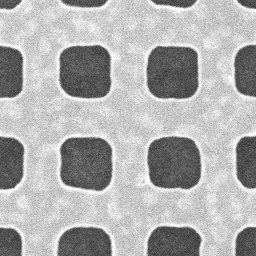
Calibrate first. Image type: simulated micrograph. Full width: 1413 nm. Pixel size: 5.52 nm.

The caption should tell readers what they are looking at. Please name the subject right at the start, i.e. holes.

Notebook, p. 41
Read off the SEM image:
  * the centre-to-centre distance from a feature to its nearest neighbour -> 484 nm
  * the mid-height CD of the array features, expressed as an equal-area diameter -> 315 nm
